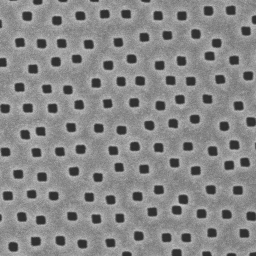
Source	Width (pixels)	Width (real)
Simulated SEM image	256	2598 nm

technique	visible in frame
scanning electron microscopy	a regular array of holes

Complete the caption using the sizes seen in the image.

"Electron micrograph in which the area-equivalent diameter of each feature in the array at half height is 0.107 micrometres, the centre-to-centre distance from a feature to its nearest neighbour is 217 nm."